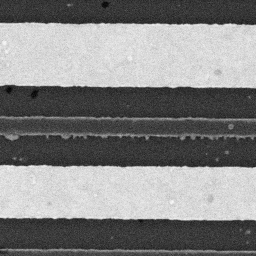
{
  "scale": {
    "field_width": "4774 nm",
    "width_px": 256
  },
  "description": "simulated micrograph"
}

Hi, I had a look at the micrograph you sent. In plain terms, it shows lines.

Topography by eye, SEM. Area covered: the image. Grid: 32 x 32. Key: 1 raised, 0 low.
00000000000000000000000000000000
00000000000000000000000000000000
00000000000000000000000000000000
11111111111111111111111111111111
11111111111111111111111111111111
11111111111111111111111111111111
11111111111111111111111111111111
11111111111111111111111111111111
11111111111111111111111111111111
11111111111111111111111111111111
11111111111111111111111111111111
00000000000000000000000000000000
00000000000000000000000000000000
00000000000000000000000000000000
00000000000000000000000000000000
11111111111111111111111111111111
11111111111111111111111111111111
00000000000000000000000000000000
00000000000000000000000000000000
00000000000000000000000000000000
00000000000000000000000000000000
11111111111111111111111111111111
11111111111111111111111111111111
11111111111111111111111111111111
11111111111111111111111111111111
11111111111111111111111111111111
11111111111111111111111111111111
00000000000000000000000000000010
00000000000000000000000000000000
00000000000000000000000000000000
00000000000000000000000000000000
11111111111111111111111111111111